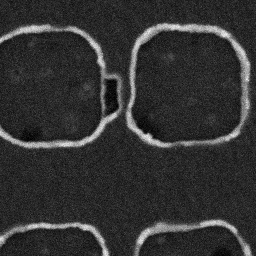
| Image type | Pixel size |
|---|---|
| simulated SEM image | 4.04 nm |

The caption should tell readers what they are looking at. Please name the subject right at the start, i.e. holes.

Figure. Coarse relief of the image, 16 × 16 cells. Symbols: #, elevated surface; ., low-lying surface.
################
################
.....####.....##
......###......#
......##.......#
.......#.......#
.......#.......#
......##.......#
#.....###.....##
################
################
################
################
################
#.....####....##
......###......#